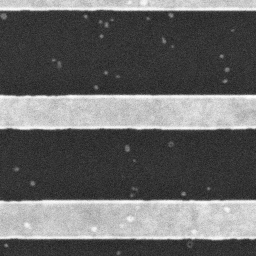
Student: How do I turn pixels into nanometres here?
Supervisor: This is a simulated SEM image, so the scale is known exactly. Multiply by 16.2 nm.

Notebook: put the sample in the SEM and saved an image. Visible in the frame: lines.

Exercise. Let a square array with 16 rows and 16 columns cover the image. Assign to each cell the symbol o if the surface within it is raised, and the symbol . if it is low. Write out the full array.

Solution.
oooooooooooooooo
................
................
................
................
................
oooooooooooooooo
oooooooooooooooo
................
................
................
................
................
oooooooooooooooo
oooooooooooooooo
................